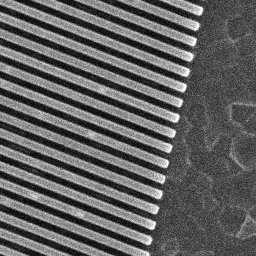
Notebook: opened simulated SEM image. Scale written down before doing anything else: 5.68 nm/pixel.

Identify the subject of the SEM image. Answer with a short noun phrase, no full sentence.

parallel lines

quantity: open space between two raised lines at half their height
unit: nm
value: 44.4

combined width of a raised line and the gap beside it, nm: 87.7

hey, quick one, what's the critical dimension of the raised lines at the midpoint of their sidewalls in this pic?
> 44.4 nm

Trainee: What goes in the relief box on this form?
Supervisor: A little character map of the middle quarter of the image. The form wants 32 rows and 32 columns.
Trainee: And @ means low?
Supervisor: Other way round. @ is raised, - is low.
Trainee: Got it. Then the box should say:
--@@@@@------@@@@@------@@@@@---
-----@@@@@------@@@@@-----@@@@@-
@@@----@@@@@@-----@@@@@------@@-
@@@@@-----@@@@@------@@@@@------
--@@@@@@----@@@@@@-----@@@@@----
----@@@@@@-----@@@@@------@@@@--
@@-----@@@@@@-----@@@@@-----@@--
@@@@@----@@@@@@-----@@@@@-------
-@@@@@@-----@@@@@@-----@@@@@----
----@@@@@@-----@@@@@-----@@@@---
@@----@@@@@@-----@@@@@@-----@---
@@@@-----@@@@@@-----@@@@@@------
-@@@@@@-----@@@@@-----@@@@@@----
----@@@@@------@@@@@-----@@@----
@------@@@@@-----@@@@@@----@----
@@@@-----@@@@@-----@@@@@@-------
-@@@@@------@@@@@-----@@@@@-----
---@@@@@@-----@@@@@-----@@@@----
@-----@@@@@------@@@@@----------
@@@------@@@@@-----@@@@@@-------
@@@@@@-----@@@@@------@@@@@-----
---@@@@@------@@@@@-----@@@-----
@-----@@@@@-----@@@@@@----------
@@@-----@@@@@------@@@@@--------
@@@@@@-----@@@@@-----@@@@@------
--@@@@@@-----@@@@@@-----@@------
-----@@@@@@-----@@@@@-----------
@@@-----@@@@@-----@@@@@@--------
@@@@@-----@@@@@@-----@@@@-------
--@@@@@@-----@@@@@@----@@-------
-----@@@@@-----@@@@@@-----------
@@-----@@@@@@-----@@@@@@--------